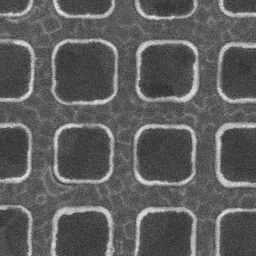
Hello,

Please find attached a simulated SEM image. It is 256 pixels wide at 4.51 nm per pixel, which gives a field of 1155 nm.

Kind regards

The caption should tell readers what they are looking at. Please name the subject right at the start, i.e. raised bodies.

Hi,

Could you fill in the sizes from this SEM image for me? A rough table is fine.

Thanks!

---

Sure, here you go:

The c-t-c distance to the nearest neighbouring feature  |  369 nanometers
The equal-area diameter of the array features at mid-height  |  297 nanometers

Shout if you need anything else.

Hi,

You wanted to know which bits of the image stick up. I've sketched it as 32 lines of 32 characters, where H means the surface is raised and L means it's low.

HHHHLLLHHHHHHHLLLHHHHHHHHLLLHHHH
HHHLLLLHHHHHHHLLLHHHHHHHLLLLHHHH
LLLLLLLLLLLLLLLLLLLLLLLLLLLLLLLL
LLLLLLLLLLLLLLLLLLLLLLLLLLLLLLLL
LLLLLLLLLLLLLLLLLLLLLLLLLLLLLLLL
HHHLLLLHHHHHHHLLLLHHHHHHLLLLLHHH
HHHHLLLHHHHHHHHLLHHHHHHHHLLLHHHH
HHHHLLHHHHHHHHHLLHHHHHHHHLLHHHHH
HHHHLLHHHHHHHHHLLHHHHHHHHLLHHHHH
HHHHLLLHHHHHHHHLLHHHHHHHHLLHHHHH
HHHHLLLHHHHHHHHLLHHHHHHHHLLHHHHH
HHHHLLLHHHHHHHHLLHHHHHHHLLLHHHHH
HHHLLLLHHHHHHHLLLLLLLHHLLLLLHHHH
LLLLLLLLLLLLLLLLLLLLLLLLLLLLLLLL
LLLLLLLLLLLLLLLLLLLLLLLLLLLLLLLL
HHLLLLLLLLLLLLLLLLLLLLLLLLLLLHHH
HHHHLLLHHHHHHHLLLHHHHHHHLLLHHHHH
HHHHLLLHHHHHHHLLLHHHHHHHLLLHHHHH
HHHHLLLHHHHHHHLLLHHHHHHHLLLHHHHH
HHHHLLLHHHHHHHLLLHHHHHHHLLLHHHHH
HHHHLLLHHHHHHHLLLHHHHHHHLLLHHHHH
HHHHLLLHHHHHHHLLLHHHHHHHLLLHHHHH
HHLLLLLLHHHHHLLLLHHHHHHHLLLLHHHH
LLLLLLLLLLLLLLLLLLLLLLLLLLLLLLLL
LLLLLLLLLLLLLLLLLLLLLLLLLLLLLLLL
LLLLLLLLLLLLLLLLLLLLLLLLLLLLLLLL
HHHLLLLHHHHHHLLLLLHHHHHHLLLLHHHH
HHHHLLLHHHHHHHLLLHHHHHHHLLLHHHHH
HHHHLLLHHHHHHHLLLHHHHHHHLLLHHHHH
HHHHLLLHHHHHHHLLLHHHHHHHLLLHHHHH
HHHHLLLHHHHHHHLLLHHHHHHHLLLHHHHH
HHHHLLLHHHHHHHLLLHHHHHHHLLLHHHHH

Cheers